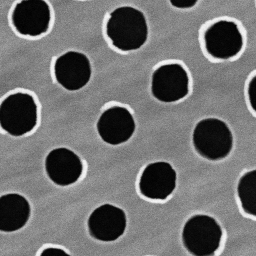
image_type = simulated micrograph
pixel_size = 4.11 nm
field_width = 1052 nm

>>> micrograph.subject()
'a regular array of holes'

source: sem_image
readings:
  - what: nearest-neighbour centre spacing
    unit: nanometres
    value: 283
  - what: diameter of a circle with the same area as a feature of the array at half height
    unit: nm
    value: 152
